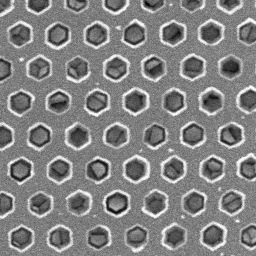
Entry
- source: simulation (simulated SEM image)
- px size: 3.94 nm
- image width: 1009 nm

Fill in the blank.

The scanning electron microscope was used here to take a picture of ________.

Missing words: a regular array of holes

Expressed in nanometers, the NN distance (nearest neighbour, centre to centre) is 150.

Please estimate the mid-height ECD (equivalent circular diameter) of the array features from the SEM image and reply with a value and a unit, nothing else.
87.6 nanometres